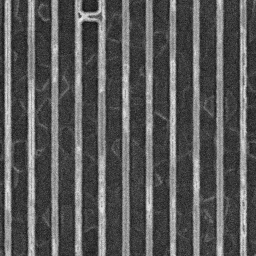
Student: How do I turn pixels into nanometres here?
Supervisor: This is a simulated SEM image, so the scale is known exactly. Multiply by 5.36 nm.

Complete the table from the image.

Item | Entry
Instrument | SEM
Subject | parallel lines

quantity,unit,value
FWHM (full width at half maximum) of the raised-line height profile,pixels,5.88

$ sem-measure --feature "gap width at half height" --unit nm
95.1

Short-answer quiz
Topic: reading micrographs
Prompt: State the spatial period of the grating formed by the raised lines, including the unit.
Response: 126 nanometers